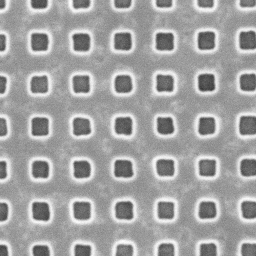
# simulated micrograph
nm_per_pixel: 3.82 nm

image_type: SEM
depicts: a regular array of holes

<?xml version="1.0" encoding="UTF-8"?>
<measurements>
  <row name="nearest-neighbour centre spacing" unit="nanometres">159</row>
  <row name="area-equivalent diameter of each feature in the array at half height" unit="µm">0.0773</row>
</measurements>